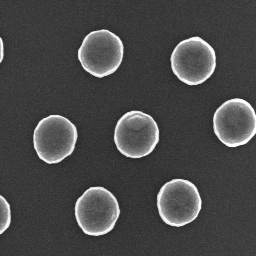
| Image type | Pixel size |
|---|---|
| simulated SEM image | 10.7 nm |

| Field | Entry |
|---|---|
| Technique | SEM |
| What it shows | raised bodies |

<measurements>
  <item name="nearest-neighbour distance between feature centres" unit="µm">0.881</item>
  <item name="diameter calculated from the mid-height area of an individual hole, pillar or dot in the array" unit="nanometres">474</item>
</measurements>